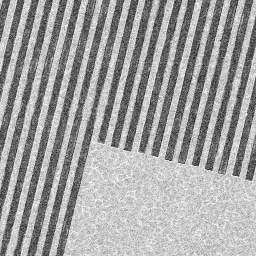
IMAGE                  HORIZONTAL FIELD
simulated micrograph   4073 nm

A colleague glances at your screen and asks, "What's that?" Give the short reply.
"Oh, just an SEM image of parallel lines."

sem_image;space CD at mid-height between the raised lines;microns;0.126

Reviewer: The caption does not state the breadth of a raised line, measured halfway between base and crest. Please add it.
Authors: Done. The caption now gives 5.95 pixels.